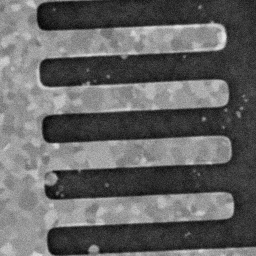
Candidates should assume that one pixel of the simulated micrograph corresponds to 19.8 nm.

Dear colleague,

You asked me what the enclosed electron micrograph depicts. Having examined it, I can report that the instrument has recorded groups of lines, slits or small figures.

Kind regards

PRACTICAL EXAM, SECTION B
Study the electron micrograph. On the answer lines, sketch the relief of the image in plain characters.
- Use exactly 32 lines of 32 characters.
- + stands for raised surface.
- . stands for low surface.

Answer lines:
+++++...........................
+++++...........................
+++++...........................
+++++...........++++++++++++....
++++++++++++++++++++++++++++....
++++++++++++++++++++++++++++....
+++++++++++++++++++++...........
+++++...........................
+++++...........................
+++++...........................
+++++.............++++++++++....
++++++++++++++++++++++++++++....
++++++++++++++++++++++++++++....
+++++++++++++++++++++++.........
++++++..........................
+++++...........................
+++++...........................
++++++............++++++++++....
+++++++++++++++++++++++++++++...
+++++++++++++++++++++++++++++...
+++++++++++++++++++++++.........
+++++++.........................
+++++++.........................
+++++...........................
++++++..............+++++++++...
+++++++++++++++++++++++++++++...
+++++++++++++++++++++++++++++...
+++++++++++++++++++++++++.......
+++++++.........................
++++++..........................
++++++..........................
++++++.....+.......+++++++++++++